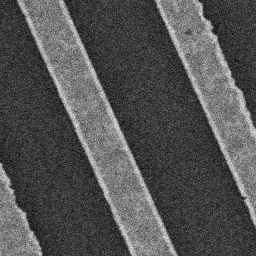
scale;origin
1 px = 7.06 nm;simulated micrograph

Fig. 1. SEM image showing one or a few lines or trenches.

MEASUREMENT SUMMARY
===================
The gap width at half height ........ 614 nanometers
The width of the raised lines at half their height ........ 0.266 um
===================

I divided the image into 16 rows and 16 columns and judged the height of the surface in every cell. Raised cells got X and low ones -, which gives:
-XXX------XXX---
--XX------XXX---
--XXX------XX---
---XX------XXX--
---XXX------XX--
----XX------XXX-
----XXX------XX-
-----XX------XXX
-----XXX------XX
-----XXX------XX
------XXX-----XX
------XXX------X
X------XX------X
XX-----XXX------
XX------XX------
XX------XXX-----